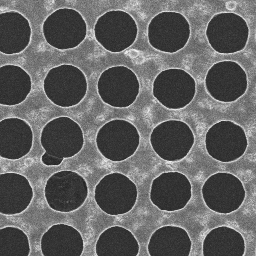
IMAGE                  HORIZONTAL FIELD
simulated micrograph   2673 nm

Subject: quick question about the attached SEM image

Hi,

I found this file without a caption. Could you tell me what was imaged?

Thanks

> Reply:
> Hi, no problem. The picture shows a regular array of holes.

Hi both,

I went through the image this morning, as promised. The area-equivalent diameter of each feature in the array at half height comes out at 436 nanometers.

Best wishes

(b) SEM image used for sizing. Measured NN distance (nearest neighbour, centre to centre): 535 nm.